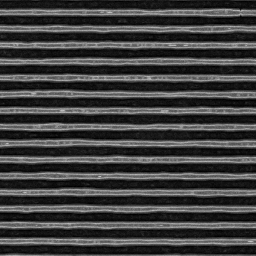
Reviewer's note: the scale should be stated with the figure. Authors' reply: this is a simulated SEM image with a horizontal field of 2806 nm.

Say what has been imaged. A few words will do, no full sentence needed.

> parallel lines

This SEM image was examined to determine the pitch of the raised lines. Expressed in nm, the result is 180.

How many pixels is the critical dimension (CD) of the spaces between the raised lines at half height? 10.1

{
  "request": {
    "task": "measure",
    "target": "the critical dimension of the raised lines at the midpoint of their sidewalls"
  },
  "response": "0.0644 µm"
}